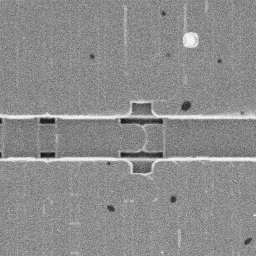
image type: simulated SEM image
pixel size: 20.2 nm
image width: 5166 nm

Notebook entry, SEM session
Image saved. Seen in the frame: wiring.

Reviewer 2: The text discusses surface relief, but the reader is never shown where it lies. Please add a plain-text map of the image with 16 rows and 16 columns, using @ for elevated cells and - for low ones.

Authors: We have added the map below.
@@@@@@@@@@@@@@@@
@@@@@@@@@@@@@@@@
@@@@@@@@@@@@@@@@
@@@@@@@@@@@@@@@@
@@@@@@@@@@@@@@@@
@@@@@@@@@@@@@@@@
@@@@@@@@@@@@@@@@
----------------
----------------
----------------
@@@@@@@@-@@@@@@@
@@@@@@@@@@@@@@@@
@@@@@@@@@@@@@@@@
@@@@@@@@@@@@@@@@
@@@@@@@@@@@@@@@@
@@@@@@@@@@@@@@@@